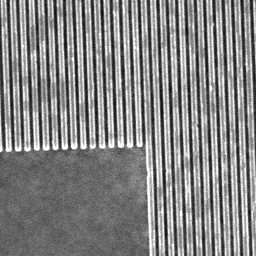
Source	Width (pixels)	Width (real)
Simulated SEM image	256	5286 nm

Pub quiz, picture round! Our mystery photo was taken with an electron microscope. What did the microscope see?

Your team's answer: parallel lines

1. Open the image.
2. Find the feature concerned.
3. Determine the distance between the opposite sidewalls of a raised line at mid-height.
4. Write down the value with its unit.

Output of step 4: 111 nm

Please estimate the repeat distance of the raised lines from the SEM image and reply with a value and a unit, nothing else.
9.34 pixels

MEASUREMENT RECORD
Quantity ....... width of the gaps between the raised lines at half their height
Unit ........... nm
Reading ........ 92.9